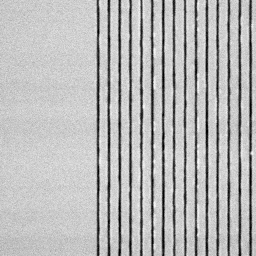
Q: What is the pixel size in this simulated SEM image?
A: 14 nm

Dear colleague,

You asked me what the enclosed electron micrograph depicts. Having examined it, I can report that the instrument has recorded parallel lines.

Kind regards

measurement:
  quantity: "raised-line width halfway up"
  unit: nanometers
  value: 108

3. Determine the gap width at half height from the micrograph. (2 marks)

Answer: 40.1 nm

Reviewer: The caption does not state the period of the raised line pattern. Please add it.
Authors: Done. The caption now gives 153 nm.